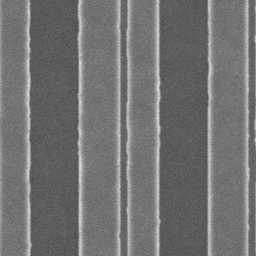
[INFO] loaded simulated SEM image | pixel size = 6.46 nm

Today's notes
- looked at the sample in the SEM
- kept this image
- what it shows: lines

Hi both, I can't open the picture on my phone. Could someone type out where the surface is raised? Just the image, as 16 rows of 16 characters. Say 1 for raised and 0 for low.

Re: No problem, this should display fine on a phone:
1100011111000111
1100011111000111
1100011111000111
1100011111000111
1100011111000111
1100011111000111
1100011111000111
1100011111000111
1100011111000111
1100011111000111
1100011111000111
1100011111000111
1100011111000111
1100011111000111
1100011111000111
1100011111000111